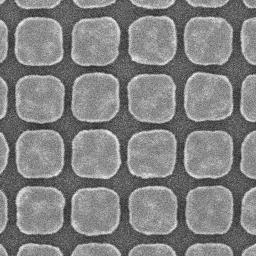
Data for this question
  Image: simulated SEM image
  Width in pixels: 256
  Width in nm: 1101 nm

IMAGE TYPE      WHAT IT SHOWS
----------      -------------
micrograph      a regular array of raised bodies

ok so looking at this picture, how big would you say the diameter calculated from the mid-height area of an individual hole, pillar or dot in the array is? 219 nm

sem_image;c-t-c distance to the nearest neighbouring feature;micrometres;0.24